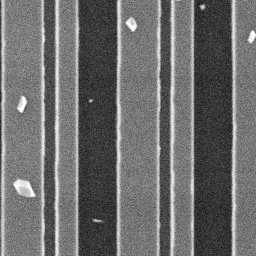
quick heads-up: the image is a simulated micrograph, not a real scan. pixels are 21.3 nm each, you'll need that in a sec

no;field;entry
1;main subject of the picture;lines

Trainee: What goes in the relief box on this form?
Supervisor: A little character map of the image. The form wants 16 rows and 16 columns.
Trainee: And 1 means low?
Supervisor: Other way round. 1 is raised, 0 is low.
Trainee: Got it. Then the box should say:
1111100111110001
1111100111110001
1111100111110001
1111100111110001
1111100111110001
1111100111110001
1111100111110001
1111100111110001
1111100111110001
1111100111110001
1111100111110001
1111100111110001
1111100111110001
1111100111110001
1111100111110001
1111100111110001